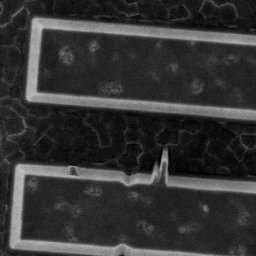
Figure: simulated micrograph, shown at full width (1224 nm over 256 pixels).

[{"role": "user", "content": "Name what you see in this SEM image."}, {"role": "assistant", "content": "one or a few lines or trenches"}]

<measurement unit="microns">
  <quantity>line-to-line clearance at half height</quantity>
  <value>0.343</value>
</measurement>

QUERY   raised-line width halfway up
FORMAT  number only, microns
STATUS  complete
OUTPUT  0.356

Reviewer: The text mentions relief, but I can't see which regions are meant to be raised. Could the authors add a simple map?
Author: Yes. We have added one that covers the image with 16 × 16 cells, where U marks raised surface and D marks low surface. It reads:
DDDDDDDDDDDDDDDD
DDDDDDDDDDDDDDDD
DDUUUUUUUUUUUUUD
DDUUUUUUUUUUUUUU
DDUUUUUUUUUUUUUU
DDUUUUUUUUUUUUUU
DDDDDDDUUUUUUUUU
DDDDDDDDDDDDDDDD
DDDDDDDDDDDDDDDD
DDDDDDDDDDDDDDDD
DDDDDDDDDDDDDDDD
DUUUUUUUUUUUUDDD
DUUUUUUUUUUUUUUU
DUUUUUUUUUUUUUUU
DUUUUUUUUUUUUUUU
DDDDUUUUUUUUUUUU